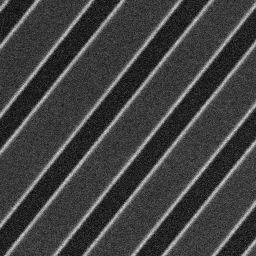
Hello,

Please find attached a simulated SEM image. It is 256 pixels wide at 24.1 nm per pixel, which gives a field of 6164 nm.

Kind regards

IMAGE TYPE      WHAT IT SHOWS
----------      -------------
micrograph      lines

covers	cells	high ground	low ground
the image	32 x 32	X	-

X---XXXXXXX----XXXXXXX----XXXXXX
---XXXXXXX----XXXXXXXX---XXXXXX-
---XXXXXXX---XXXXXXXX---XXXXXXX-
--XXXXXXX---XXXXXXXX----XXXXXX--
-XXXXXXX----XXXXXXX----XXXXXX---
XXXXXXX----XXXXXXX----XXXXXX----
XXXXXXX---XXXXXXXX---XXXXXX----X
XXXXXX---XXXXXXXX---XXXXXXX---XX
XXXXX---XXXXXXXX---XXXXXXX---XXX
XXXX----XXXXXXX----XXXXXX----XXX
XXX----XXXXXXX----XXXXXX----XXXX
XXX---XXXXXXXX---XXXXXX----XXXXX
XX---XXXXXXXX---XXXXXXX---XXXXXX
X---XXXXXXXX---XXXXXXX---XXXXXXX
----XXXXXXX----XXXXXX----XXXXXX-
---XXXXXXX----XXXXXX----XXXXXX--
--XXXXXXXX---XXXXXX----XXXXXX---
-XXXXXXXX---XXXXXXX---XXXXXX----
XXXXXXXX---XXXXXXX---XXXXXXX---X
XXXXXXX----XXXXXX---XXXXXXX---XX
XXXXXX----XXXXXX----XXXXXX----XX
XXXXXX---XXXXXX----XXXXXX----XXX
XXXXX---XXXXXXX---XXXXXX----XXXX
XXXX---XXXXXXX---XXXXXXX---XXXXX
XXX----XXXXXX---XXXXXXX---XXXXXX
XX----XXXXXX----XXXXXX----XXXXXX
XX---XXXXXX----XXXXXX----XXXXXX-
X---XXXXXXX---XXXXXX----XXXXXX--
---XXXXXXX---XXXXXXX---XXXXXXX--
---XXXXXX---XXXXXXX---XXXXXXX---
--XXXXXX----XXXXXX---XXXXXXX----
-XXXXXX----XXXXXX----XXXXXX----X